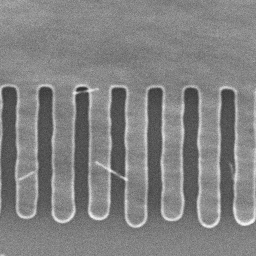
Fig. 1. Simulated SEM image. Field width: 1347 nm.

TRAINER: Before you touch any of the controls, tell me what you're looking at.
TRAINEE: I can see groups of lines, slits or small figures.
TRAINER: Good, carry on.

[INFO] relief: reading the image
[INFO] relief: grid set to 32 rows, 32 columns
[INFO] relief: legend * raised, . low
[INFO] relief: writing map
********************************
********************************
********************************
********************************
********************************
********************************
********************************
********************************
********************************
********************************
********************************
..***..***.***..***.***..***.***
..***..**..***..**..***..***.***
..***..**..***..**..***..***..**
..***..**..***..**..***..**...**
..***..**..***..**..***..**..***
..***..**..***..**..***..**..***
..***..**..***..**..***..**..***
..***..**..***..**..***..**..***
..***..**..***..**..***..**..***
..***..**..***..**..***..**...**
..***..**..***..**..***..**...**
..***..**..***..**..***..**..***
..***..**..***..**..***..**..***
..***..**..***..**..***..**..***
..***..**..***..**..***..**..***
..**...**..***..**..***..**..***
.......**.......**...*...**...**
................................
................................
................................
................................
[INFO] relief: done